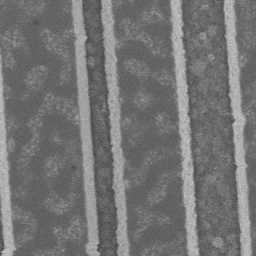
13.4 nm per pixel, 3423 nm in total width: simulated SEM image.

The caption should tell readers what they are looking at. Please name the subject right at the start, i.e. one or a few lines or trenches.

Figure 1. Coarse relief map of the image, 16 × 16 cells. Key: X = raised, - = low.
XXXXX--XXXX---XX
XXXXX--XXXX---XX
XXXXX--XXXX----X
XXXXX--XXXX----X
XXXXX--XXXX----X
XXXXX--XXXX----X
XXXXX--XXXX----X
XXXXX--XXXX----X
XXXXX--XXXXX---X
XXXXX--XXXXX---X
XXXXX--XXXXX---X
XXXXXX-XXXXX---X
XXXXXX--XXXX---X
XXXXXX--XXXX---X
-XXXXX--XXXX---X
-XXXXX--XXXX---X